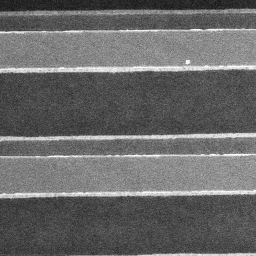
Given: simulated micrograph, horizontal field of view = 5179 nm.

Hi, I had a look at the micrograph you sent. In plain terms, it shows lines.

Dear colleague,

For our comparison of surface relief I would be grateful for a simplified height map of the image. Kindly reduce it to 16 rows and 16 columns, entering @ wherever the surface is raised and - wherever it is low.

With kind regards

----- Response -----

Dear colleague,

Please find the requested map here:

----------------
----------------
@@@@@@@@@@@@@@@@
@@@@@@@@@@@@@@@@
----------------
----------------
----------------
----------------
----------------
----------------
@@@@@@@@@@@@@@@@
@@@@@@@@@@@@@@@@
----------------
----------------
----------------
----------------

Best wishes